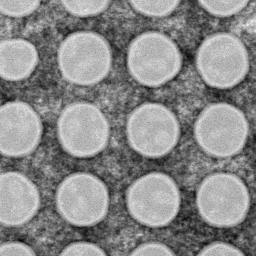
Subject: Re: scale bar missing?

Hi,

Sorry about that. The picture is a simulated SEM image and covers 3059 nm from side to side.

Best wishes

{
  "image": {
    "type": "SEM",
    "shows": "a regular array of raised bodies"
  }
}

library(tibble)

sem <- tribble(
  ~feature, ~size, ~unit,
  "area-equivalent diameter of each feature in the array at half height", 622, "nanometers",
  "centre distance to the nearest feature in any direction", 0.821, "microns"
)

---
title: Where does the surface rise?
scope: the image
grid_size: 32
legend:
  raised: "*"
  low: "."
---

*****...*****....*****...******.
.***.....***......***.....***...
................................
................................
.........***......**.......**...
****....*****....*****...*****..
****...*******..******...******.
****...*******..*******..******.
****....******..******...******.
***.....*****....*****...*****..
..................**......***...
................................
................................
****....****.....****.....***...
*****...*****...******...*****..
*****..******...******...******.
*****..*******..******..*******.
*****...*****...******...******.
****....*****....****....*****..
.*........*.......**.......*....
................................
................................
***.....****.....****.....****..
****...******...******...******.
*****..******...******...******.
*****..******...******...******.
****....*****...******...******.
***......***.....****.....****..
................................
................................
.*.......**.......**.......*....
****....*****....****....*****..